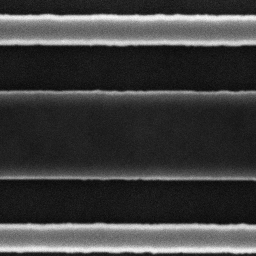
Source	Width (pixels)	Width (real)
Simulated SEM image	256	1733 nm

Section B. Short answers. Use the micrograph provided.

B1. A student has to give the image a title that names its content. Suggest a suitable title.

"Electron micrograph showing lines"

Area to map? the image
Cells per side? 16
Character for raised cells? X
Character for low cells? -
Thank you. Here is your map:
----------------
XXXXXXXXXXXXXXXX
XXXXXXXXXXXXXXXX
----------------
----------------
----------------
XXXXXXXXXXXXXXXX
XXXXXXXXXXXXXXXX
XXXXXXXXXXXXXXXX
XXXXXXXXXXXXXXXX
XXXXXXXXXXXXXXXX
----------------
----------------
----------------
XXXXXXXXXXXXXXXX
XXXXXXXXXXXXXXXX